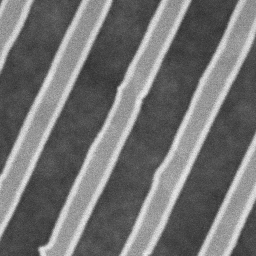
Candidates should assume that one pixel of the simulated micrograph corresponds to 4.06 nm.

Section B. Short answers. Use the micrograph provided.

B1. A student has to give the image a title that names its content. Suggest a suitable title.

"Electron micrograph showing one or a few lines or trenches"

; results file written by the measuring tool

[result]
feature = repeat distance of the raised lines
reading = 289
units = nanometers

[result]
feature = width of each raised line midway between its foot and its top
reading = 91.8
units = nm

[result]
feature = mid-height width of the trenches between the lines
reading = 198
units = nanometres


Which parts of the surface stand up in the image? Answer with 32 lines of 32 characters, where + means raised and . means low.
++++......++++......+++.......++
+++.......+++.......+++.......++
+++......++++......+++.......+++
++.......+++.......+++.......+++
++......++++.......++.......+++.
+.......+++.......+++.......+++.
+.......+++......+++.......++++.
.......+++.......+++.......+++..
.......+++......+++.......++++..
......+++.......+++.......+++...
......+++......++++......++++...
.....+++.......+++.......+++....
.....+++.......++.......++++....
....+++.......+++.......+++.....
....+++.......+++.......+++.....
...+++.......+++.......+++......
...+++.......+++.......+++......
..+++.......+++.......+++.......
..+++.......+++.......+++.......
..+++......+++.......+++.......+
.+++.......+++.......+++.......+
.+++......+++.......+++.......++
+++.......+++......++++.......++
+++......++++......+++.......+++
++.......+++.......+++.......+++
++.......+++......+++.......+++.
+.......+++.......+++.......+++.
+.......+++......++++......+++..
.......+++.......+++.......+++..
.......+++.......+++......+++...
......+++.......+++.......+++...
.....++++.......++.......+++....